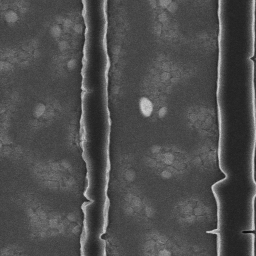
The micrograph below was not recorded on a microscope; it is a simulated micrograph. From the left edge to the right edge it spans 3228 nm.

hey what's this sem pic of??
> one or a few lines or trenches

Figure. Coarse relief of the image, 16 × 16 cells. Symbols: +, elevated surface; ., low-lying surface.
.....++.......++
.....++.......++
.....++.......++
.....++.......++
.....++.......++
.....++.......++
.....++.......++
.....++.......++
.....++.......++
.....++.......++
.....++.......++
.....++.......++
.....++.......++
.....++.......++
.....+.......+++
.....++.......++